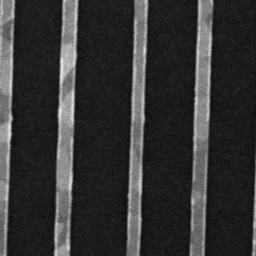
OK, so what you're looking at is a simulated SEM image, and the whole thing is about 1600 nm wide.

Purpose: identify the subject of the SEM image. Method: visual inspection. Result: one or a few lines or trenches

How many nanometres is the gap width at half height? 319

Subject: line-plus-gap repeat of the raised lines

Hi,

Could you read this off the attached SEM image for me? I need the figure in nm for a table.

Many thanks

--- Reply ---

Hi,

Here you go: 423